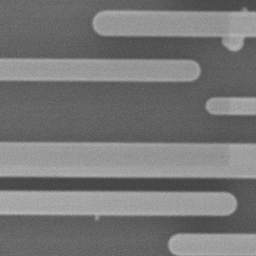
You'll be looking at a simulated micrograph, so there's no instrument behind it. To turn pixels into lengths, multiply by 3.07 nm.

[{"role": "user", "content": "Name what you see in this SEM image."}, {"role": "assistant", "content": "groups of lines, slits or small figures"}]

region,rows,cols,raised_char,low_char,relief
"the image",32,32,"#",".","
................................
.............##########.........
............####################
............####################
.................###############
................................
................................
########################........
#########################.......
#########################.......
................................
................................
..........................######
..........................######
................................
................................
................................
................................
################################
################################
################################
################################
................................
................................
#############################...
##############################..
#############################...
................................
................................
......................##########
.....................###########
.....................###########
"